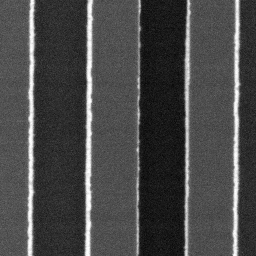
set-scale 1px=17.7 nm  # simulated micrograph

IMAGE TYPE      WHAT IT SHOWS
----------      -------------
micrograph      lines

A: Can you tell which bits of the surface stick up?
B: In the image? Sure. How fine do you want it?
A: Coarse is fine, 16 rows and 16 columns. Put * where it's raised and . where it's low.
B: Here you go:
**....***...***.
**....***...***.
**....***...***.
**....***...***.
**....***...***.
**....***...***.
**....***...***.
**....***...***.
**....***...***.
**....***...***.
**....***...***.
**....***...***.
**....***...***.
**....***...***.
**....***...***.
**....***...***.